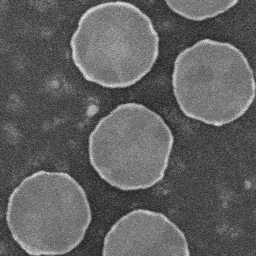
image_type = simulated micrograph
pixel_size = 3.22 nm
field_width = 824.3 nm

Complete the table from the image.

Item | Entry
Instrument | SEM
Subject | raised bodies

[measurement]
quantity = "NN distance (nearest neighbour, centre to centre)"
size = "337 nanometers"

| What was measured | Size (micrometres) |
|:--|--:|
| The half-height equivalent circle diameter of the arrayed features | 0.268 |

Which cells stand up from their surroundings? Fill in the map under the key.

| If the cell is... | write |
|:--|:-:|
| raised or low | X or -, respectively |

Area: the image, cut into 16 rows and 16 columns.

------XX---XXX--
-----XXXX-------
-----XXXXX------
-----XXXXX-XXXX-
-----XXXX--XXXXX
-----------XXXXX
-----------XXXXX
------XXXX---XX-
------XXXXX-----
------XXXXX-----
------XXXX------
-XXXX--XXX------
-XXXX-----------
XXXXXX--XX------
-XXXX--XXXX-----
-XXXX--XXXXX----